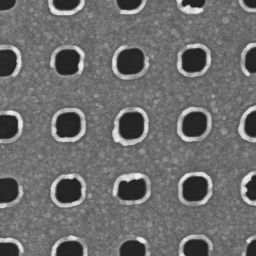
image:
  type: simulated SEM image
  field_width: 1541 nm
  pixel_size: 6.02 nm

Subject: a regular array of holes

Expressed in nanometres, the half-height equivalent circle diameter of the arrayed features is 158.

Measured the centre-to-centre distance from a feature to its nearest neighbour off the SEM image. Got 379 nanometers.